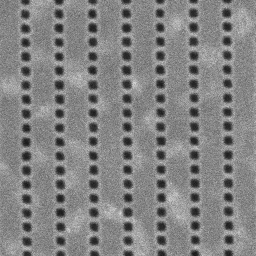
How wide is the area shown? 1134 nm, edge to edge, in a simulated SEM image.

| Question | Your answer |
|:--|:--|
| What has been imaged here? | a regular array of holes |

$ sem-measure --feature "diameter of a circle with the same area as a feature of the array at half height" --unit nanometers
43.6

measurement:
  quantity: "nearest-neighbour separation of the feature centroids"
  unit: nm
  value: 62.2